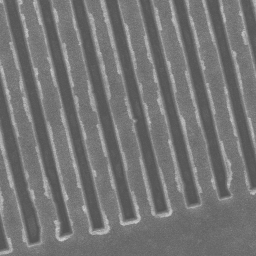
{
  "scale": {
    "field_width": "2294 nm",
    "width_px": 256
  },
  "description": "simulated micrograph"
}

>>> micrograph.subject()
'parallel lines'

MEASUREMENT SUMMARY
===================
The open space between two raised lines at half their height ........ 0.108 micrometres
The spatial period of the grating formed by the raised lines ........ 293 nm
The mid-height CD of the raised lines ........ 184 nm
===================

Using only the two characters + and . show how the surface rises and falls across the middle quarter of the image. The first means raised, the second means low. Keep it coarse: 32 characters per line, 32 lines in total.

++++++...+++++...++++++...+++++.
.+++++...+++++...++++++...+++++.
.+++++...++++++...+++++...+++++.
.+++++....+++++...+++++....+++++
.++++++...+++++...++++++...+++++
..+++++...+++++...++++++...+++++
..+++++...++++++...+++++...+++++
..+++++...++++++...+++++...+++++
..++++++...+++++...++++++..+++++
...+++++...+++++....+++++...++++
...+++++...++++++...+++++...++++
...+++++....+++++...+++++...++++
...+++++....+++++...+++++...++++
....+++++...+++++....+++++...+++
+...+++++...++++++...+++++...+++
+...+++++...++++++...+++++...+++
+...++++++...+++++...+++++....++
+...++++++...+++++...++++++...++
++...+++++...++++++...+++++...++
++...+++++...++++++...+++++...++
++...+++++....+++++...+++++...++
++...++++++...+++++...++++++...+
+++...+++++...+++++....+++++...+
+++...+++++...++++++...+++++...+
+++...+++++....+++++...+++++....
+++...++++++...+++++...++++++...
+++....+++++...+++++...++++++...
++++...+++++...++++++...+++++...
++++...++++++...+++++...+++++...
++++...++++++...+++++...++++++..
++++....+++++...+++++....+++++..
+++++...+++++...++++++...+++++..